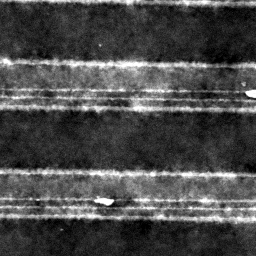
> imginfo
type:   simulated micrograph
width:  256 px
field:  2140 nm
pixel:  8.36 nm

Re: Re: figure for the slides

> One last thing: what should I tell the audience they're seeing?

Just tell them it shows lines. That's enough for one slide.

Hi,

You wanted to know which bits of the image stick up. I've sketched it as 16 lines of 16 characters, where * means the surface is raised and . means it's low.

................
................
................
................
****************
****************
****************
................
................
................
................
****************
****************
......**********
................
................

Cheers